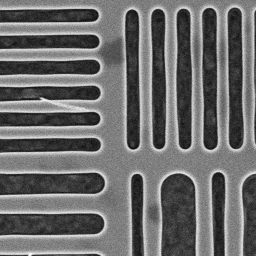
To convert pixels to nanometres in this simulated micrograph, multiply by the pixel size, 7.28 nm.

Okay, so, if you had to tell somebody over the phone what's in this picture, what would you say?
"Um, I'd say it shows groups of lines, slits or small figures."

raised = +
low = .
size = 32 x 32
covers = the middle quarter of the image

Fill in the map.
.........++++++....+++...+++....
.........++++++....+++...+++....
........+++++++....+++...+++....
+++++++++++++++....+++....++....
+++++++++++++++....+++....++....
++++....+++++++....+++....++....
.........++++++....+++....++....
.........++++++....+++....++....
.........++++++....+++....++....
+++++++++++++++....+++....++....
+++++++++++++++....+++....++....
+++++++++++++++....+++....++....
........+++++++....+++....++....
.........++++++....+++....++....
.........++++++....+++....++....
...++++++++++++....+++....++....
+++++++++++++++....+++...++++...
+++++++++++++++....+++...++++...
........+++++++....+++...++++...
.........+++++++...+++...++++...
.........+++++++...+++...++++...
.........+++++++++++++++++++++++
++++++++++++++++++++++++++++++++
++++++++++++++++++++++++++++++++
++++++++++++++++++++++++++++++++
++++++++++++++++++++++++++++++++
++++++++++++++++++++++++++++++++
.........+++++++++.++++++++...++
..........+++++++...++++++......
..........+++++++...+++++.......
..........+++++++...++++........
..........+++++++...++++........